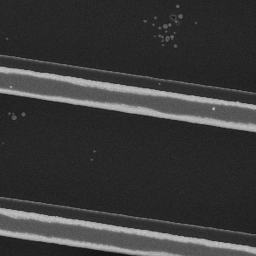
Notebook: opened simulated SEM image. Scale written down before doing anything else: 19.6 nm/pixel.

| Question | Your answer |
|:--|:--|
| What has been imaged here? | lines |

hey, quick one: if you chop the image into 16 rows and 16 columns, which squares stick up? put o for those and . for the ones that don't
................
................
................
................
ooooooo.........
oooooooooooooo..
.....ooooooooooo
...........ooooo
................
................
................
................
o...............
oooooooo........
ooooooooooooooo.
.....ooooooooooo